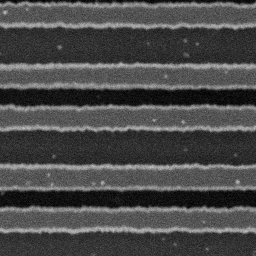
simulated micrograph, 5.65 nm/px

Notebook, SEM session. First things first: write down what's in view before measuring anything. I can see lines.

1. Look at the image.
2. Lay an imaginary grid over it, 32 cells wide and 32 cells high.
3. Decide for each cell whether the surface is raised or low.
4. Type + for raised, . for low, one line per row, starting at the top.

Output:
++++++++++++++++++++++++++++++++
++++++++++++++++++++++++++++++++
++++++++++++++++++++++++++++++++
.........+........+..+....++.++.
................................
................................
................................
................................
++++++++++++++++++++++++++++++++
++++++++++++++++++++++++++++++++
++++++++++++++++++++++++++++++++
................................
................................
++++++++++++++++++++++++++++++++
++++++++++++++++++++++++++++++++
++++++++++++++++++++++++++++++++
................................
................................
................................
................................
................................
++++++++++++++++++++++++++++++++
++++++++++++++++++++++++++++++++
++++++++++++++++++++++++++++++++
................................
................................
++++++++++++++++++++++++++++++++
++++++++++++++++++++++++++++++++
++++++++++++++++++++++++++++++++
................................
................................
................................